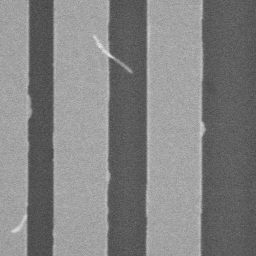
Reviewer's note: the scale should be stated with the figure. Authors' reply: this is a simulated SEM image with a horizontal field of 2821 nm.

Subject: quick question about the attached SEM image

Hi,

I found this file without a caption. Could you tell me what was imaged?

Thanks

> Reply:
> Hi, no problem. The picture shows lines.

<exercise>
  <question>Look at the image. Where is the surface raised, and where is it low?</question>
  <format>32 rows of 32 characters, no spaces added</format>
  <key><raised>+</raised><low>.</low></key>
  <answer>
++++...+++++++....+++++++.......
++++...+++++++....+++++++.......
++++...+++++++.....++++++.......
++++...++++++......++++++.......
++++...++++++......++++++.......
++++...+++++++....+++++++.......
++++...+++++++....+++++++.......
++++...+++++++....+++++++.......
++++...+++++++....+++++++.......
++++...+++++++....+++++++.......
++++...+++++++....+++++++.......
+++....+++++++....+++++++.......
+++....+++++++....+++++++.......
+++....++++++.....+++++++.......
+++....++++++.....+++++++.......
+++....++++++.....+++++++.......
+++....++++++.....+++++++.......
+++....++++++.....+++++++.......
++++...++++++.....+++++++.......
+++....++++++.....+++++++.......
+++....++++++.....+++++++.......
+++....++++++.....+++++++.......
+++....++++++.....+++++++.......
+++....++++++.....+++++++.......
+++....++++++.....+++++++.......
+++....++++++.....+++++++.......
+++....++++++.....+++++++.......
+++....++++++.....+++++++.......
+++....++++++.....+++++++.......
+++....++++++.....+++++++.......
+++....++++++.....+++++++.......
+++....++++++.....+++++++.......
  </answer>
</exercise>